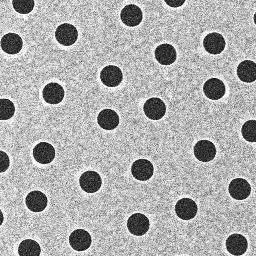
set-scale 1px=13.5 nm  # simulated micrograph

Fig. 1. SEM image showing a regular array of holes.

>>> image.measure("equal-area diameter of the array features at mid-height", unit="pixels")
22.8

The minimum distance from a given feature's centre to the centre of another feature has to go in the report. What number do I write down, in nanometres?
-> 679